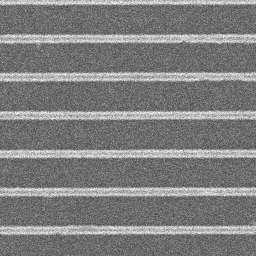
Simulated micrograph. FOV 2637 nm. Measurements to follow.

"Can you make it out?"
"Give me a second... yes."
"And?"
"parallel lines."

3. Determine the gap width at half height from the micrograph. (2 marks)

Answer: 334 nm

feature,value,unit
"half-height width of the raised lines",61.8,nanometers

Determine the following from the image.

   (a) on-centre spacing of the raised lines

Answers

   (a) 38.3 px